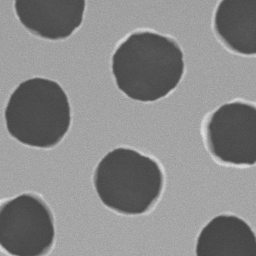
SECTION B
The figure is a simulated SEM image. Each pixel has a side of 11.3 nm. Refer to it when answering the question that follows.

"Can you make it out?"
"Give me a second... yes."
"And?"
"holes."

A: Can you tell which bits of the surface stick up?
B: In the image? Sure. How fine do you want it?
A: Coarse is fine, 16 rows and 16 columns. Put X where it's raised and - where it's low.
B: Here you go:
X----XXXXXXXXX--
X----XXXXXXXX---
XXXXXXXX---XXX--
XXXXXXX----XXXXX
XXXXXXX----XXXXX
X---XXXX---XXXXX
----XXXXXXXXXX-X
----XXXXXXXXX---
X---XXXXXXXXX---
XXXXXXX-XXXXX---
XXXXXX----XXXXXX
XXXXXX----XXXXXX
X--XXX----XXXXXX
---XXXXXXXXXXXXX
---XXXXXXXXXX---
---XXXXXXXXX----